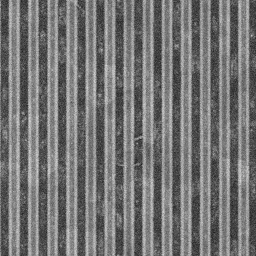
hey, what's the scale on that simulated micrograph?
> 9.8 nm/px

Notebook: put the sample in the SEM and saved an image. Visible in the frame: parallel lines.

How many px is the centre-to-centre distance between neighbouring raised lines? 19.2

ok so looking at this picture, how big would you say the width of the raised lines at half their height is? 0.0784 um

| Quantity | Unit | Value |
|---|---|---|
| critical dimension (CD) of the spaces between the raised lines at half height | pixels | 11.5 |